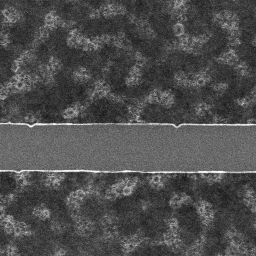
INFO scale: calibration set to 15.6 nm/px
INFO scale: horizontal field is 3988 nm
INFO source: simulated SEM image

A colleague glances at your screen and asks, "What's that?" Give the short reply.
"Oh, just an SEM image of one or a few lines or trenches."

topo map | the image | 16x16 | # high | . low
################
################
################
################
################
################
################
################
................
................
................
################
################
################
################
################